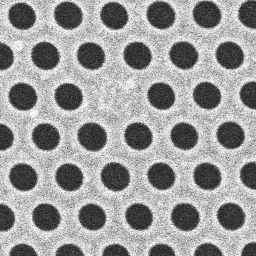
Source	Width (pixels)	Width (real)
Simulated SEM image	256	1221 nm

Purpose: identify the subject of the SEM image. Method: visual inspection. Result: a regular array of holes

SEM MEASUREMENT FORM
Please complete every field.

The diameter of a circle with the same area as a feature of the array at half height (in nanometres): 132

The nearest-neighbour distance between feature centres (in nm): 219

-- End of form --